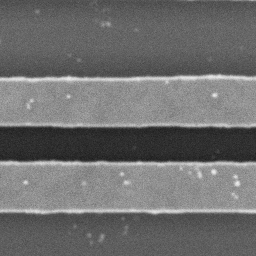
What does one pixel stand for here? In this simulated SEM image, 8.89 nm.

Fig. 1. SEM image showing lines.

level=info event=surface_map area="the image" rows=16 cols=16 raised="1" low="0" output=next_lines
0000000000000000
0000000000000000
0000000000000000
0000000000000000
0000000000000000
1111111111111111
1111111111111111
1111111111111111
0000000000000000
0000000000000000
1111111111111111
1111111111111111
1111111111111111
0000000000000000
0000000000000000
0000000000000000